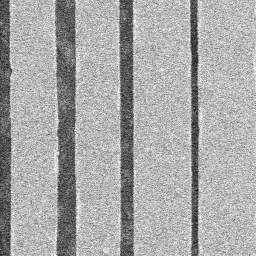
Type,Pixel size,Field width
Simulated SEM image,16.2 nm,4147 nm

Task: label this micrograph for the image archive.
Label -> one or a few lines or trenches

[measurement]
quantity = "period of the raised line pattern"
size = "1040 nanometers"